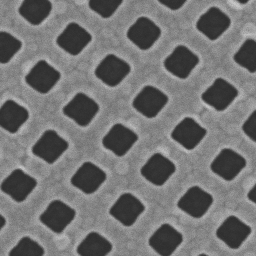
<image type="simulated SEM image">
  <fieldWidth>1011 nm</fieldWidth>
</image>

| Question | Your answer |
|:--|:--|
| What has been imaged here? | a regular array of holes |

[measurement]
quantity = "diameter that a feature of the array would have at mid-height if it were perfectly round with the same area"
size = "120 nm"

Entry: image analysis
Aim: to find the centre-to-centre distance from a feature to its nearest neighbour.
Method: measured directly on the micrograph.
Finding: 193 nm